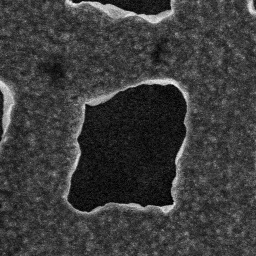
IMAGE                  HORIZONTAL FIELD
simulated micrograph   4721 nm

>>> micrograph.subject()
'holes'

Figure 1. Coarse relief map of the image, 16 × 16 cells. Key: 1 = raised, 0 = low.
1111111000011111
1111111111111111
1111111111111111
1111111111111111
1111111111111111
1111111100011111
1111110000001111
1111100000001111
1111100000001111
1111100000011111
1111100000011111
1111000000011111
1111000000011111
1111111111111111
1111111111111111
1111111111111111